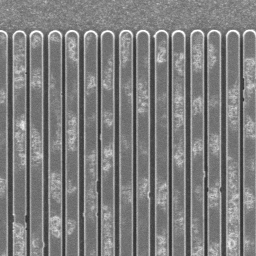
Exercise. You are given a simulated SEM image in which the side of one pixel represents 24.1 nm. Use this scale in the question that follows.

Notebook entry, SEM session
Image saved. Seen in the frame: parallel lines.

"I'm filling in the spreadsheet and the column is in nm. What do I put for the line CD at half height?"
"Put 319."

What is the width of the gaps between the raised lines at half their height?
114 nanometres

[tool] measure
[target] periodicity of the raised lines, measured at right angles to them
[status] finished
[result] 428 nanometers